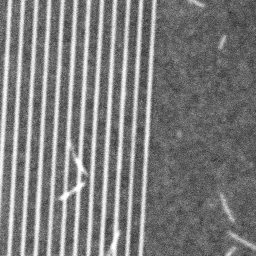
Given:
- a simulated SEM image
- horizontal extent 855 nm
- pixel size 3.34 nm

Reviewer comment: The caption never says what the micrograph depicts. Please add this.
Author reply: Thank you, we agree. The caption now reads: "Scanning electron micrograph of parallel lines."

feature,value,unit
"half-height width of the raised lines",8.3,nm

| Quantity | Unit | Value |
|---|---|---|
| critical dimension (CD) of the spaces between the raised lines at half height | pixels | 11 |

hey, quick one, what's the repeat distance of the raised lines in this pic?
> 43.8 nm